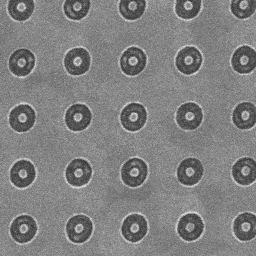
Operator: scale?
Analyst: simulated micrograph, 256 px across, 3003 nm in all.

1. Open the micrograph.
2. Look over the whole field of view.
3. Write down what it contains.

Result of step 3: a regular array of ring-shaped grooves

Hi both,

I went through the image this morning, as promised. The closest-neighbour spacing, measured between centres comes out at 647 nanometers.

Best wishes